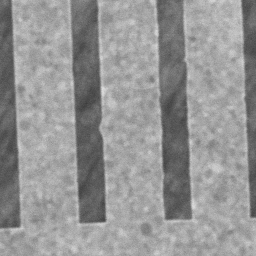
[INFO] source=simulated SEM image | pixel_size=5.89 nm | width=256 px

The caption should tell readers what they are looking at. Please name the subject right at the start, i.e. one or a few lines or trenches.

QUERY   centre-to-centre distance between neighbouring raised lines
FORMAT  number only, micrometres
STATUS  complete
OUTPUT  0.505